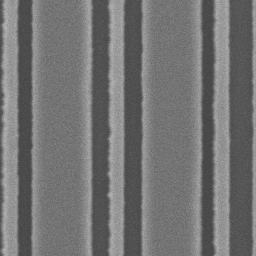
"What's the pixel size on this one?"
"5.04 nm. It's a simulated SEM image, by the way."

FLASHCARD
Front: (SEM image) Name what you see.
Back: lines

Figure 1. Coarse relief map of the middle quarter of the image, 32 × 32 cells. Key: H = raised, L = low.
HHHHHHHLLLLHHHHLLLLLHHHHHHHHHHHH
HHHHHHHLLLLHHHHLLLLLHHHHHHHHHHHH
HHHHHHHLLLLHHHHLLLLHHHHHHHHHHHHH
HHHHHHHLLLLHHHHLLLLHHHHHHHHHHHHH
HHHHHHHLLLLLHHHLLLLLHHHHHHHHHHHH
HHHHHHHLLLLHHHHLLLLLHHHHHHHHHHHH
HHHHHHHLLLLHHHHLLLLLHHHHHHHHHHHH
HHHHHHHLLLLHHHHLLLLLHHHHHHHHHHHH
HHHHHHHLLLLLHHHLLLLLHHHHHHHHHHHH
HHHHHHHLLLLHHHHLLLLLHHHHHHHHHHHH
HHHHHHHLLLLHHHHLLLLLHHHHHHHHHHHH
HHHHHHHLLLLHHHHLLLLLHHHHHHHHHHHH
HHHHHHHLLLLHHHHLLLLLHHHHHHHHHHHH
HHHHHHHLLLLHHHHLLLLLHHHHHHHHHHHH
HHHHHHHLLLLHHHHLLLLLHHHHHHHHHHHH
HHHHHHHLLLLHHHHLLLLLHHHHHHHHHHHH
HHHHHHHLLLLLHHHLLLLLHHHHHHHHHHHH
HHHHHHHLLLLLHHHLLLLLHHHHHHHHHHHH
HHHHHHHLLLLHHHHLLLLLHHHHHHHHHHHH
HHHHHHHLLLLHHHHLLLLLHHHHHHHHHHHH
HHHHHHHLLLLHHHHLLLLLHHHHHHHHHHHH
HHHHHHHLLLLHHHHLLLLLHHHHHHHHHHHH
HHHHHHHLLLLHHHHLLLLLHHHHHHHHHHHH
HHHHHHHLLLLHHHHLLLLLHHHHHHHHHHHH
HHHHHHHLLLLHHHHLLLLLHHHHHHHHHHHH
HHHHHHHLLLLHHHHLLLLLHHHHHHHHHHHH
HHHHHHHLLLLHHHHLLLLLHHHHHHHHHHHH
HHHHHHHLLLLHHHHLLLLLHHHHHHHHHHHH
HHHHHHHLLLLHHHHLLLLLHHHHHHHHHHHH
HHHHHHHLLLLHHHHLLLLLHHHHHHHHHHHH
HHHHHHHLLLLHHHHLLLLLHHHHHHHHHHHH
HHHHHHHLLLLHHHHLLLLLHHHHHHHHHHHH